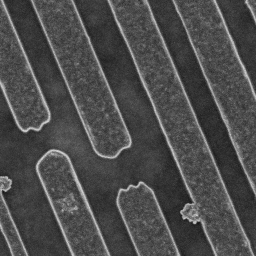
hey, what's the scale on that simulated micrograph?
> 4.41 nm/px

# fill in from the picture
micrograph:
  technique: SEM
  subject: one or a few lines or trenches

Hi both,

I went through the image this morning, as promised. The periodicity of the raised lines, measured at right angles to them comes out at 66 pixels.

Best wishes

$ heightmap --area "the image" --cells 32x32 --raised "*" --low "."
....*****.....****....*****....*
*....*****....*****...******...*
*....*****.....****....*****....
**...******....*****...*****....
**....*****....*****....*****...
***...*****.....*****...*****...
***....*****....*****...******..
***....*****.....****....*****..
****....*****....*****...*****..
****....*****.....****....*****.
*****...*****.....*****...*****.
.****....*****....*****...******
.****....*****.....****....*****
.*****....*****....*****...*****
..****....*****.....****....****
..***.....******....*****...****
...........*****.....****....***
...........*****.....*****...***
............****.....*****...***
......**.....*........*****...**
.....****.............*****...**
.....****..............****....*
*....*****.............*****...*
*.....****......***....*****....
......*****....****.....*****...
*.....*****....*****....*****...
*......****....*****...******...
**.....*****...******...******..
**......****....*****....*****..
.*......*****...*****.....*****.
.**......****....*****....*****.
.**......****....*****.....****.